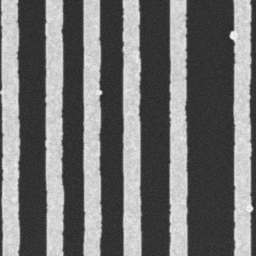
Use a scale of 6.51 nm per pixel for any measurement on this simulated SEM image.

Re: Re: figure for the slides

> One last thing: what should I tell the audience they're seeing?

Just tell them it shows lines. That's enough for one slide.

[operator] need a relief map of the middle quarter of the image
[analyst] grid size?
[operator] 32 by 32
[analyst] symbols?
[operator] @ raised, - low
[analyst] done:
-----@@@@------@@@@--------@@@--
-----@@@@------@@@@--------@@@@-
-----@@@@------@@@@--------@@@@-
-----@@@@------@@@@--------@@@--
-----@@@@------@@@@--------@@@--
-----@@@@------@@@@--------@@@--
-----@@@@------@@@@--------@@@--
-----@@@@------@@@@--------@@@--
-----@@@@------@@@@--------@@@--
-----@@@@------@@@@--------@@@--
-----@@@@------@@@@--------@@@--
-----@@@@------@@@@--------@@@--
-----@@@@------@@@@--------@@@--
-----@@@@------@@@@--------@@@--
-----@@@@------@@@@--------@@@@-
-----@@@@------@@@@--------@@@@-
-----@@@@------@@@@--------@@@--
-----@@@@------@@@@--------@@@@-
-----@@@@------@@@@--------@@@@-
-----@@@@------@@@@--------@@@@-
-----@@@@------@@@@--------@@@@-
-----@@@@------@@@@--------@@@@-
-----@@@@------@@@@--------@@@@-
-----@@@@------@@@@--------@@@@-
-----@@@@------@@@@--------@@@@-
-----@@@@------@@@@--------@@@@-
-----@@@@------@@@@--------@@@@-
-----@@@@------@@@@--------@@@@-
-----@@@@------@@@@--------@@@@-
-----@@@@------@@@@--------@@@@-
-----@@@@------@@@@--------@@@@-
-----@@@@------@@@@--------@@@@-